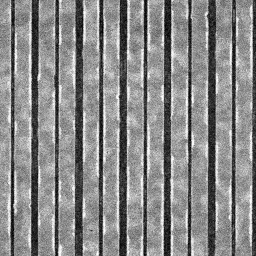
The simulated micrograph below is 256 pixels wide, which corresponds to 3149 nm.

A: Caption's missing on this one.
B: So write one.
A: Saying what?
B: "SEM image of parallel lines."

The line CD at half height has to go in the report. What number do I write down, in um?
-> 0.198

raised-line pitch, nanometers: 272